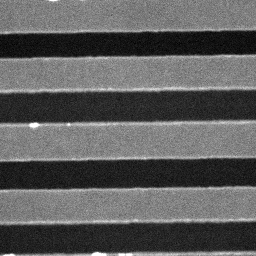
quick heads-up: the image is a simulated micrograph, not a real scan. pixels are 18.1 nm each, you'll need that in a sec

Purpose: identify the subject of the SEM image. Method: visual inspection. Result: lines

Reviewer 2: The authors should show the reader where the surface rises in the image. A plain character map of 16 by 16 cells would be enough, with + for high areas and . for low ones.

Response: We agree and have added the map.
++++++++++++++++
++++++++++++++++
................
.............+++
++++++++++++++++
+++++++++++++++.
................
................
++++++++++++++++
++++++++++++++++
................
................
++++++++++++++++
++++++++++++++++
................
................